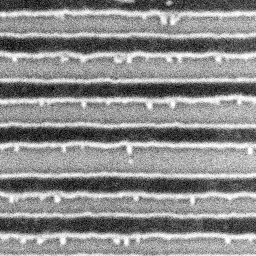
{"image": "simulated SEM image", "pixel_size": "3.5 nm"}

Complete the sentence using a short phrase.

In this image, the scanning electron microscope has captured lines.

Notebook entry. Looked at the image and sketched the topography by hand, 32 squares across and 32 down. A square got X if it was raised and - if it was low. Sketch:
XXXXXXXXXXXXXXXXXXXXXXXXXXXXXXXX
XXXXXXXXXXXXXXXXXXXXXXXXXXXXXXXX
--------------------XX----------
--------------------------------
XXXXXXXXXXXXXXXXXXXXXXXXXXXXXXXX
XXXXXXXXXXXXXXXXXXXXXXXXXXXXXXXX
XXXXXXXXXXXXXXXXXXXXXXXXXXXXXXXX
--------------------------------
--------------------------------
--------------------------------
XXXXXXXXXXXXXXXXXXXXXXXXXXXXXXXX
XXXXXXXXXXXXXXXXXXXXXXXXXXXXXXXX
XXXXXXXXXXXXXXXXXXXXXX-XXXX-----
--------------------------------
--------------------------------
-X-------X----------------------
XXXXXXXXXXXXXXXXXXXXXXXXXXXXXXXX
XXXXXXXXXXXXXXXXXXXXXXXXXXXXXXXX
-------------------------------X
--------------------------------
--------------------------------
--------------------------------
XXXXXXXXXXXXXXXXXXXXXXXXXXXXXXXX
XXXXXXXXXXXXXXXXXXXXXXXXXXXXXXXX
-XX----XX---X-X----XXXXXXX--XX--
--------------------------------
--------------------------------
XXXXXXXXXXXXXXXXXXXXXXXXXXXXXXXX
XXXXXXXXXXXXXXXXXXXXXXXXXXXXXXXX
XXXXXXXXXXXXXXXXXXX-XXXXX--XXXXX
--------------------------------
--------------------------------